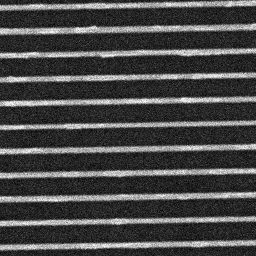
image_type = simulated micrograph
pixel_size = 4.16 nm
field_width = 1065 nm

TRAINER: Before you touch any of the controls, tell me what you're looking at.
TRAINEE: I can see parallel lines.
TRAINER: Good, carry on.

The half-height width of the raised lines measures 18.2 nanometers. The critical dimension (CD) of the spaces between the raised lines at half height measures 0.0801 µm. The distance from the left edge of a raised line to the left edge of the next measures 24 px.